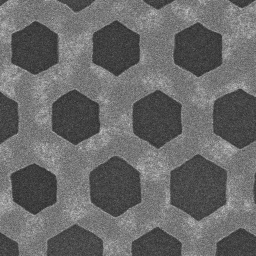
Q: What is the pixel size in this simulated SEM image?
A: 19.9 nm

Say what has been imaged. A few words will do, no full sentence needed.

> a regular array of holes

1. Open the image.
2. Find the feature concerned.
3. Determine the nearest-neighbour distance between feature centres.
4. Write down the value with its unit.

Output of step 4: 1590 nm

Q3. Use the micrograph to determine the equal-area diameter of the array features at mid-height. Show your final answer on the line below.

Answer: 1010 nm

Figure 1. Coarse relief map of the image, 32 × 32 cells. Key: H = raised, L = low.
HHHHHHHHLLLHHHHHHHLLLHHHHHHHHLLH
HHHHHHHHHLHHHHHHHHHHHHHHHHHHHHHH
HHHHHHHHHHHHHHHHHHHHHHHHHHHHHHHH
HHHLLLHHHHHHHLLLHHHHHHHLLLHHHHHH
HHLLLLLHHHHHLLLLLHHHHHLLLLLLHHHH
HLLLLLLHHHHHLLLLLHHHHHLLLLLLHHHH
HLLLLLLHHHHHLLLLLLHHHHLLLLLLHHHH
HLLLLLLHHHHHLLLLLHHHHHLLLLLLHHHH
HHHLLLHHHHHHHLLLHHHHHHHLLLLHHHHH
HHHHHHHHHHHHHHHHHHHHHHHHHHHHHHHH
HHHHHHHHHHHHHHHHHHHHHHHHHHHHHHHH
HHHHHHHHLLHHHHHHHHHLHHHHHHHHHLLH
LLHHHHHLLLLHHHHHHLLLLLHHHHHLLLLL
LLHHHHLLLLLLHHHHLLLLLLLHHHHLLLLL
LLHHHHLLLLLLHHHHHLLLLLLHHHHLLLLL
LLHHHHLLLLLLLHHHHLLLLLLHHHHLLLLL
LLHHHHHLLLLLHHHHHLLLLLLHHHHLLLLL
LHHHHHHHLLLHHHHHHHLLLHHHHHHHLLLL
HHHHHHHHHHHHHHHHHHHHHHHHHHHHHHHH
HHHHHHHHHHHHHHHHHHHHHHHHLHHHHHHH
HHHHLHHHHHHHHLLLHHHHHHHLLLLHHHHH
HHLLLLHHHHHLLLLLLHHHHLLLLLLLHHHH
HLLLLLLHHHHLLLLLLLHHHLLLLLLLHHHH
HLLLLLLHHHHLLLLLLLHHHLLLLLLLHHHH
HHLLLLLHHHHLLLLLLLHHHLLLLLLLHHHH
HHLLLLLHHHHHLLLLLHHHHHLLLLLLHHHH
HHHHLHHHHHHHHLLLHHHHHHHLLLLHHHHH
HHHHHHHHHHHHHHHHHHHHHHHHHHHHHHHH
HHHHHHHHLLHHHHHHHHHLHHHHHHHHHHHH
LHHHHHHLLLLLHHHHHHLLLLHHHHHHLLLL
LLHHHHLLLLLLLHHHLLLLLLLHHHHLLLLL
LLHHHHLLLLLLLHHHLLLLLLLHHHHLLLLL